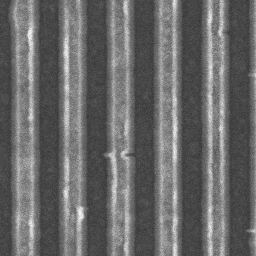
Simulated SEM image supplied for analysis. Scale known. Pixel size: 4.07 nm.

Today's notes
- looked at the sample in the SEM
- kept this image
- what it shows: parallel lines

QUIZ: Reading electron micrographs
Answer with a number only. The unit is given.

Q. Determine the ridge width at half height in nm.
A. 82.4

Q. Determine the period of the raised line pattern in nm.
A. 194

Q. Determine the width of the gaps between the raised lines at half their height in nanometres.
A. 114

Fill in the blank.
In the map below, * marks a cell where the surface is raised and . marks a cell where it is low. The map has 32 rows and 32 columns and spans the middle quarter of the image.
*****.......****.......******...
*****.......****.......******...
*****.......****.......******...
*****.......****.......******...
****........****........*****...
*****.......****........*****...
*****.......****........****....
*****.......****........****....
****........****........****....
****........*****......******...
****........****.......******...
****........****........*****...
****........****........****....
****........*****.......*****...
****........*****.......*****...
****........*****.......*****...
****........*****.......*****...
****........*****.......*****...
****........*****......******...
****........*****......******...
****........*****.......*****...
*****.......*****.......*****...
*****......*****........*****...
****.......******.......*****...
****........*****.......*****...
****........*****.......*****...
****........*****.......*****...
****........*****.......****....
*****.......*****.......*****...
*****.......*****.......*****...
*****.......*****.......*****...
*****.......*****.......*****...